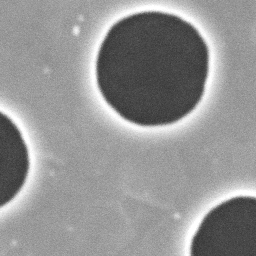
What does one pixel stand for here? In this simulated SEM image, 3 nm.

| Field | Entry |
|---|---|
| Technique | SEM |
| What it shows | holes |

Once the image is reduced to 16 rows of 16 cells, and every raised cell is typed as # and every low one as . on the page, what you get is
################
#######.....####
######.......###
######.......###
######.......###
######.......###
#######.....####
.#######...#####
.###############
..##############
..##############
.###############
.#############..
#############...
############....
############....